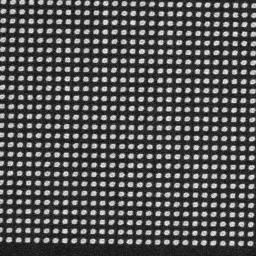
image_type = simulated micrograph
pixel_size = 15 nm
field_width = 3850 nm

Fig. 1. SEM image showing a regular array of raised bodies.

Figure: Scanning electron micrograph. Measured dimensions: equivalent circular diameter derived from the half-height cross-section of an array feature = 74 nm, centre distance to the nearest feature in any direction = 136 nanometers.